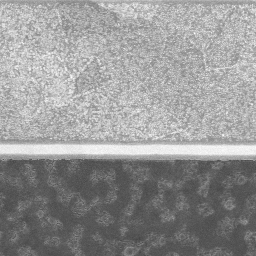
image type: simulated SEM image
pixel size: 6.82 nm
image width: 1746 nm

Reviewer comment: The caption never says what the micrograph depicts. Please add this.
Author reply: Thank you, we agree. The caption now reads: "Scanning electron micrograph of one or a few lines or trenches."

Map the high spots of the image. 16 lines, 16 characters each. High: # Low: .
################
################
################
################
################
################
################
################
################
................
................
................
................
................
................
................